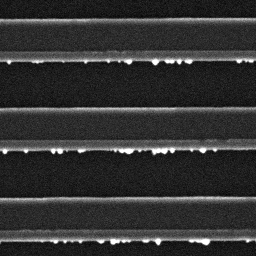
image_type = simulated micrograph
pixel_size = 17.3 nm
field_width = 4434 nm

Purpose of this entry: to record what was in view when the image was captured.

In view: lines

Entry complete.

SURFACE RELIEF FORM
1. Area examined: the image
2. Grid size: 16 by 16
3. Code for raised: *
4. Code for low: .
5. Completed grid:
................
****************
****************
****************
................
................
................
****************
****************
................
................
................
****************
****************
****************
................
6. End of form